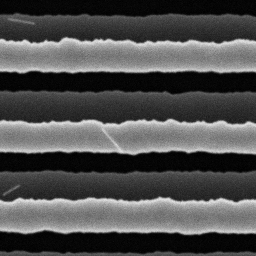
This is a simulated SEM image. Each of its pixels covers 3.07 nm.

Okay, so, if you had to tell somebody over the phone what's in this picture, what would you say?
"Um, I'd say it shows lines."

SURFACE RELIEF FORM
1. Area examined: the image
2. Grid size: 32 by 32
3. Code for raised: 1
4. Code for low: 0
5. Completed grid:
00000000000000000000000000000000
00000000000000000000000000000000
11111111111111111111111111111111
11111111111111111111111111111111
11111111111111111111111111111111
11111111111111111111111111111111
11111111111111111111111111111111
11111111111111111111111111111111
11111111111111111111111111111111
00000000000000000000000000000000
00000000000000000000000000000000
10110100100001100000000010000000
11111111111111111111111111111111
11111111111111111111111111111111
11111111111111111111111111111111
11111111111111111111111111111111
11111111111111111111111111111111
11111111111111111111111111111111
11111111111111111111111111111111
00000000000000000000000000000000
00000000000000000000000000000000
10011111000000000000011010100001
11111111111111111111111111111111
11111111111111111111111111111111
11111111111111111111111111111111
11111111111111111111111111111111
11111111111111111111111111111111
11111111111111111111111111111111
11111111111111111111111111111111
00000000000000000000000000000000
00000000000000000000000000000000
01100000000000000000000000000000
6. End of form